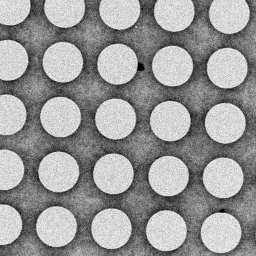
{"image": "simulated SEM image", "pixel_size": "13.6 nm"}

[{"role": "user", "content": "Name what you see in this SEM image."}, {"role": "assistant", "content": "an array of small figures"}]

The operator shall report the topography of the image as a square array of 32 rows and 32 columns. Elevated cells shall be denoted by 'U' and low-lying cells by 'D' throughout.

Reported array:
UUUUDDUUUUUDDUUUUDDDUUUUDDDUUUUD
UUUUDDUUUUDDUUUUUDDUUUUUDDUUUUUD
UUUDDDUUUUDDDUUUUDDDUUUUDDUUUUUD
DDDDDDDDDDDDDDUUDDDDUUUDDDDUUUDD
DDDDDDDDDDDDDDDDDDDDDDDDDDDDDDDD
UUDDDDDUUDDDDDDDDDDDDDDDDDDDDDDD
UUUDDDUUUUDDDUUUUDDDUUUDDDDUUUDD
UUUDDUUUUUDDUUUUUDDUUUUUDDUUUUUD
UUUDDUUUUUDDUUUUUDDUUUUUDDUUUUUD
UUDDDDUUUUDDDUUUUDDUUUUUDDUUUUUD
DDDDDDDDDDDDDDDDDDDDUUUDDDDUUUDD
DDDDDDDDDDDDDDDDDDDDDDDDDDDDDDDD
UUDDDDUUUDDDDDUDDDDDDDDDDDDDDDDD
UUUDDUUUUUDDUUUUUDDUUUUDDDDUUUDD
UUUDDUUUUUDDUUUUUDDUUUUUDDUUUUDD
UUUDDUUUUUDDUUUUUDDUUUUUDDUUUUUD
UUDDDDUUUDDDDUUUDDDUUUUDDDUUUUDD
DDDDDDDDDDDDDDDDDDDDUUDDDDDUUDDD
DDDDDDDDDDDDDDDDDDDDDDDDDDDDDDDD
UUDDDDUUUDDDDUUDDDDDDDDDDDDDDDDD
UUUDDUUUUUDDUUUUDDDUUUUDDDUUUUDD
UUUDDUUUUUDDUUUUUDDUUUUDDDUUUUDD
UUUDDUUUUUDDUUUUUDDUUUUUDUUUUUDD
UDDDDDUUUDDDUUUUDDDUUUUDDDUUUUDD
DDDDDDDDDDDDDDDDDDDDDDDDDDDUUDDD
DDDDDDDDDDDDDDDDDDDDDDDDDDDDDDDD
UUDDDUUUUDDDDUUDDDDDUUDDDDDDDDDD
UUUDDUUUUDDDUUUUDDDUUUUDDDUUUUDD
UUUDDUUUUDDUUUUUDDUUUUUDDUUUUUDD
UUDDDUUUUDDDUUUUDDUUUUUDDUUUUUDD
UDDDDDUUDDDDUUUDDDDUUUUDDDUUUUDD
DDDDDDDDDDDDDDDDDDDDDDDDDDDUDDDD